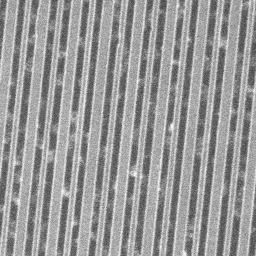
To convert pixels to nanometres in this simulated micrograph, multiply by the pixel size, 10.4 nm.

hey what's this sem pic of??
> parallel lines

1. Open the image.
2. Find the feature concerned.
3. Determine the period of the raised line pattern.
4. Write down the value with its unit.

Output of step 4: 164 nm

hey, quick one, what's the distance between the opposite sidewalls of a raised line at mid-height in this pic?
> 95.4 nm